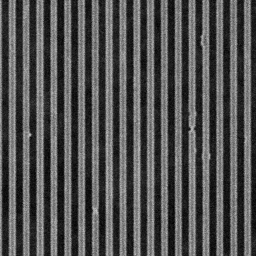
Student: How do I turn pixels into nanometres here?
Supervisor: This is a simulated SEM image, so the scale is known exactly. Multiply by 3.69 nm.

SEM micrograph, parallel lines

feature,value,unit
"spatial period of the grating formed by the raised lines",51.1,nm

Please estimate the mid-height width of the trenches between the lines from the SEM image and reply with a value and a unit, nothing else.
0.0286 micrometres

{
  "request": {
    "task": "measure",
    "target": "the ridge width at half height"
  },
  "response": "21.2 nanometers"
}